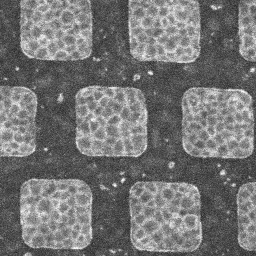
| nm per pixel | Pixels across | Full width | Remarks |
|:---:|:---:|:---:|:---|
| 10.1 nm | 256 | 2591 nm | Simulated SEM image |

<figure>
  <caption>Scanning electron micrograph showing raised bodies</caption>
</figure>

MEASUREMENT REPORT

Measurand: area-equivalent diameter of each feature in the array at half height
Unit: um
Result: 0.776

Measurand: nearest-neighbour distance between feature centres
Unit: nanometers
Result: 1080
